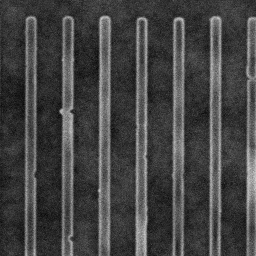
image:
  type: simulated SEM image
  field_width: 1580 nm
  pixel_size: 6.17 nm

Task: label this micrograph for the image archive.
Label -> parallel lines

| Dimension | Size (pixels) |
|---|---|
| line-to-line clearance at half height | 27.9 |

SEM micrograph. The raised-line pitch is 228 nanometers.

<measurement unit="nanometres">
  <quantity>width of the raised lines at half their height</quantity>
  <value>57.1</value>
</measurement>